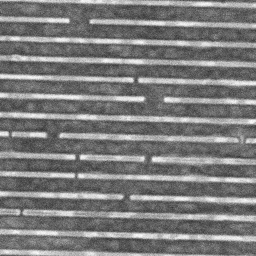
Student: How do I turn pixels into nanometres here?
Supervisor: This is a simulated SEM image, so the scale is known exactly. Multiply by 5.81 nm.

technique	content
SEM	parallel lines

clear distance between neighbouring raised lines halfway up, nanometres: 90.1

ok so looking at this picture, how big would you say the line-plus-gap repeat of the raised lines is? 19.4 px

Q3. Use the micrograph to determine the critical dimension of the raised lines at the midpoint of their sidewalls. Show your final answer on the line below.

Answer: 22.5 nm